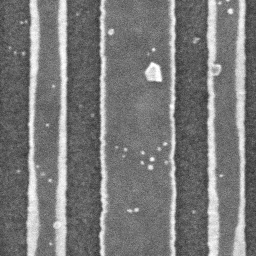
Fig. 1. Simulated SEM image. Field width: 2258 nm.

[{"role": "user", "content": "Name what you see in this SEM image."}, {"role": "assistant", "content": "lines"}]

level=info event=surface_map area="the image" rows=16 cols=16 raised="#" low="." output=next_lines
..##..#####..##.
..##..#####..##.
..##..#####..##.
..##..#####..##.
..##..#####..##.
..##..#####..##.
..##..#####..##.
..##..#####..##.
..##..#####..##.
..##..#####..##.
..##..#####..##.
..##..#####..##.
..##..#####..##.
..##..#####..##.
..##..#####..##.
..##..#####..##.